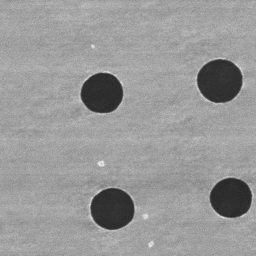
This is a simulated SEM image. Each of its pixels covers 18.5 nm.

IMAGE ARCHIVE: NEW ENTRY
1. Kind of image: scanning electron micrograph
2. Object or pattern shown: holes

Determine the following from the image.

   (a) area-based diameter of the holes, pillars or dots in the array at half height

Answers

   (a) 783 nm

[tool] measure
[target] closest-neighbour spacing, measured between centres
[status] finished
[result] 2.16 micrometres